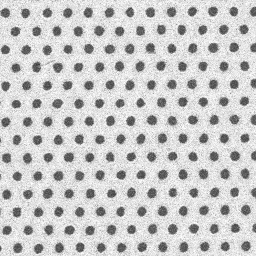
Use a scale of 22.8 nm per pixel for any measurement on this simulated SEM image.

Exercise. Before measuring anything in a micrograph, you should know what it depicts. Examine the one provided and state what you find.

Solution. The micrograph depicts a regular array of holes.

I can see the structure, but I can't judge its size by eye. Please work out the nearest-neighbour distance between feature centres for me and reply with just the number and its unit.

0.461 micrometres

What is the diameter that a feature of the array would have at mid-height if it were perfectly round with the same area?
0.225 micrometres